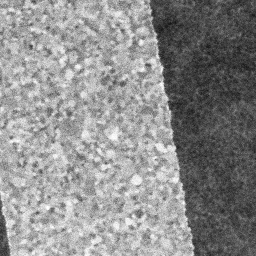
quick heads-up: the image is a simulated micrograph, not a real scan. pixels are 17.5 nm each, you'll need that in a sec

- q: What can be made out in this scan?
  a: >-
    one or a few lines or trenches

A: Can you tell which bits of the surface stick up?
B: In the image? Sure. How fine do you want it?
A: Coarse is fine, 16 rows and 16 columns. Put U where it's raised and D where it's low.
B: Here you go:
UUUUUUUUUDDDDDDD
UUUUUUUUUUDDDDDD
UUUUUUUUUUDDDDDD
UUUUUUUUUUDDDDDD
UUUUUUUUUUDDDDDD
UUUUUUUUUUDDDDDD
UUUUUUUUUUDDDDDD
UUUUUUUUUUUDDDDD
UUUUUUUUUUUDDDDD
UUUUUUUUUUUDDDDD
UUUUUUUUUUUDDDDD
UUUUUUUUUUUDDDDD
UUUUUUUUUUUUDDDD
UUUUUUUUUUUUDDDD
UUUUUUUUUUUUDDDD
DUUUUUUUUUUUDDDD